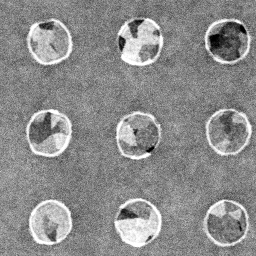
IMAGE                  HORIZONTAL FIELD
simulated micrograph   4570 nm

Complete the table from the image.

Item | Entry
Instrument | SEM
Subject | a regular array of raised bodies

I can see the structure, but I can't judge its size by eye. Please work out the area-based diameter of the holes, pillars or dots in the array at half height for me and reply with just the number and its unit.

0.773 µm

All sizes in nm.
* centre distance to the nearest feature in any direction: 1570